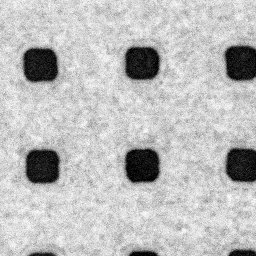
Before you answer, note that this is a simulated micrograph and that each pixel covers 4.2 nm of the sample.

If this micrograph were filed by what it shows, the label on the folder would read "holes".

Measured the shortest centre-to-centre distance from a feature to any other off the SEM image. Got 0.422 um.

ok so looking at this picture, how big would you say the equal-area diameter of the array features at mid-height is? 174 nm